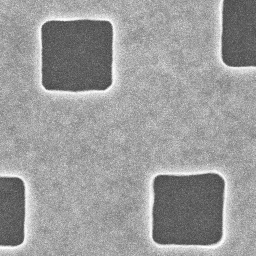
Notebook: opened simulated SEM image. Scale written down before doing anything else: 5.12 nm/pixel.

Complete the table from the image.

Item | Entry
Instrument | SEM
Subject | holes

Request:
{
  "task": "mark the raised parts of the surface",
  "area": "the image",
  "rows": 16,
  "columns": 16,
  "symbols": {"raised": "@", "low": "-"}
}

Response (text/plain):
@@@@@@@@@@@@@@--
@@@----@@@@@@@--
@@@----@@@@@@@--
@@@----@@@@@@@--
@@@----@@@@@@@@@
@@@----@@@@@@@@@
@@@@@@@@@@@@@@@@
@@@@@@@@@@@@@@@@
@@@@@@@@@@@@@@@@
@@@@@@@@@@@@@@@@
@@@@@@@@@@@@@@@@
-@@@@@@@@@----@@
--@@@@@@@@----@@
--@@@@@@@-----@@
--@@@@@@@@----@@
@@@@@@@@@@@@@@@@